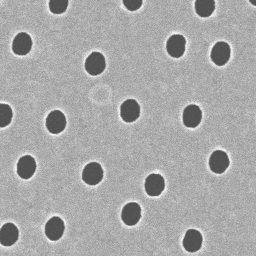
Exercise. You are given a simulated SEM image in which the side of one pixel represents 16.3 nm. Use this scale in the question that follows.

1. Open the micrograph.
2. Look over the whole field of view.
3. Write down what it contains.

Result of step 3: a regular array of holes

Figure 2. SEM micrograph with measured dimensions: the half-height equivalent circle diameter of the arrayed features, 367 nanometres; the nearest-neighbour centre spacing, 53.9 pixels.